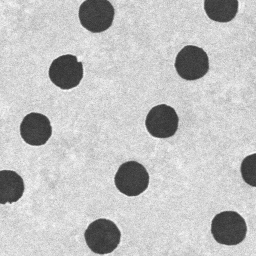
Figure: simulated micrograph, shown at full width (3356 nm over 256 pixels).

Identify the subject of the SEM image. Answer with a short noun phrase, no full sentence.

holes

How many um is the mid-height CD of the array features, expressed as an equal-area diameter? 0.457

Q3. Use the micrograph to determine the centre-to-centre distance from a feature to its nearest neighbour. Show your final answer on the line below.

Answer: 0.852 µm